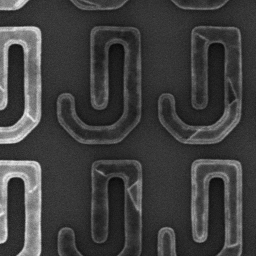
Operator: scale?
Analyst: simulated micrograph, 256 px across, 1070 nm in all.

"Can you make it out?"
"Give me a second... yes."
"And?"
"wiring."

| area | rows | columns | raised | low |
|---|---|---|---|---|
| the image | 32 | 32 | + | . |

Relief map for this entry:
+++......++++++.......++++++....
................................
................................
+++++.......+++++.......+++++...
+++++......++++++.......++++++..
+++++......+++.++.......++..++..
+..++......+++..+.......++..++..
+..++......++...++......++..++..
+..++......++...++......++..++..
+..++......++...++......++..++..
+..++......++...++......++..++..
+..++......++...++......++..++..
+..++..++..++...++..++..++..++..
...++..++...+...++..++......++..
...++..+++.....+++..++......++..
..+++...+++...+++...+++....+++..
++++....++++++++.....++++++++...
+++.......+++++.......++++++....
................................
................................
+++++.......+++++.......++++++..
+++++.......++++++......++++++..
+..++.......++.+++......++..++..
+..++.......+...++......++..++..
+..++.......+...++......++..++..
+..++.......+...++......++..++..
+..++.......+...++......++..++..
+..++.......+...++......++..++..
+..++.......+...++......++..++..
+..++..++...+...++..++..++..++..
...++..++.......++..++......++..
...++..+++.....+++..++......++..